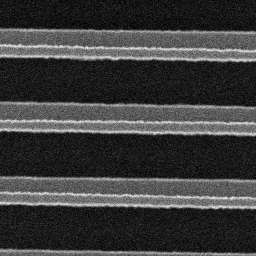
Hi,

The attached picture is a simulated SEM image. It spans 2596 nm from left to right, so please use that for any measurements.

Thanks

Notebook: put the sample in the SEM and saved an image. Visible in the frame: lines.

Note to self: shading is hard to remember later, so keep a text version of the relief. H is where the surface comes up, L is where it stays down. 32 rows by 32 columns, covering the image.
LLLLLLLLLLLLLLLLLLLLLLLLLLLLLLLL
LLLLLLLLLLLLLLLLLLLLLLLLLLLLLLLL
LLLLLLLLLLLLLLLLLLLLLLLLLLLLLLLL
LLLLLLLLLLLLLLLLLLLLLLLLLLLLLLLL
HHHHHHHHHHHHHHHHHHHHHHHHHHHHHHHH
HHHHHHHHHHHHHHHHHHHHHHHHHHHHHHHH
HHHHHHHHHHHHHHHHHHHHHHHHHHHHHHHH
LLLLLLLLLLLLLLLLLLLLHHHHHHHHHHHH
LLLLLLLLLLLLLLLLLLLLLLLLLLLLLLLL
LLLLLLLLLLLLLLLLLLLLLLLLLLLLLLLL
LLLLLLLLLLLLLLLLLLLLLLLLLLLLLLLL
LLLLLLLLLLLLLLLLLLLLLLLLLLLLLLLL
LLLLLLLLLLLLLLLLLLLLLLLLLLLLLLLL
HHHHHHHHHHHHHHHHHHHHHHHHHHHHHHHH
HHHHHHHHHHHHHHHHHHHHHHHHHHHHHHHH
HHHHHHHHHHHHHHHHHHHHHHHHHHHHHHHH
LLLLLLLHLHHHHHHHHHHHHHHHHHHHHHHH
LLLLLLLLLLLLLLLLLLLLLLLLLLLLLLLL
LLLLLLLLLLLLLLLLLLLLLLLLLLLLLLLL
LLLLLLLLLLLLLLLLLLLLLLLLLLLLLLLL
LLLLLLLLLLLLLLLLLLLLLLLLLLLLLLLL
LLLLLLLLLLLLLLLLLLLLLLLLLLLLLLLL
HHHHHHHHHHHHHHHHHHHHHHHHHHHLLLLL
HHHHHHHHHHHHHHHHHHHHHHHHHHHHHHHH
HHHHHHHHHHHHHHHHHHHHHHHHHHHHHHHH
HHLHHHHHHHHHHHHHHHHHHHHHHHHHHHHH
LLLLLLLLLLLLLLLLLLLLLLLLLLLLLLLL
LLLLLLLLLLLLLLLLLLLLLLLLLLLLLLLL
LLLLLLLLLLLLLLLLLLLLLLLLLLLLLLLL
LLLLLLLLLLLLLLLLLLLLLLLLLLLLLLLL
LLLLLLLLLLLLLLLLLLLLLLLLLLLLLLLL
HHHHHHHHHHHHHHHHHHHLLLLLLLLLLLLL